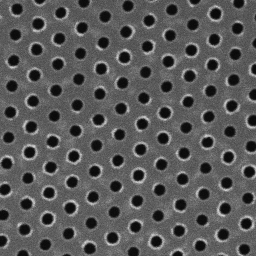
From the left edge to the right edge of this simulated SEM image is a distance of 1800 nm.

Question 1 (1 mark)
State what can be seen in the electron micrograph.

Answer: a regular array of holes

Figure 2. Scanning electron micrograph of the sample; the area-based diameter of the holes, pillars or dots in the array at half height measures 81.6 nm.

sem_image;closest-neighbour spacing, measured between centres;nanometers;177